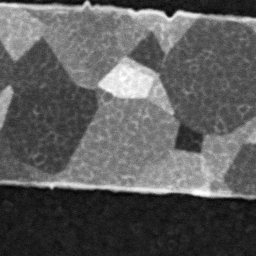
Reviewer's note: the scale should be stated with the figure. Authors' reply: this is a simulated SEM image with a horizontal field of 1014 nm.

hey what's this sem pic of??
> one or a few lines or trenches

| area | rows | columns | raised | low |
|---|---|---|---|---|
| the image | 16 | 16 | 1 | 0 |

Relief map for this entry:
1111010000000000
1111111111111111
1111111111111111
1111111111111111
1111111111111111
1111111111111111
1111111111111111
1111111111111111
1111111111111111
1111111111111111
1111111111111111
0001111111111111
0000000000000000
0000000000000000
0000000000000000
0000000000000000